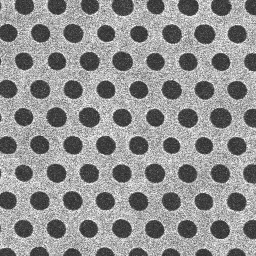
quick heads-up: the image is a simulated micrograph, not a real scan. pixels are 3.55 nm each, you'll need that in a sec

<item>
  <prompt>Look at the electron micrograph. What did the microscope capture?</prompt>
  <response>a regular array of holes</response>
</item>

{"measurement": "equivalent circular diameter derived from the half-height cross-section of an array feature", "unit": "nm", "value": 66.4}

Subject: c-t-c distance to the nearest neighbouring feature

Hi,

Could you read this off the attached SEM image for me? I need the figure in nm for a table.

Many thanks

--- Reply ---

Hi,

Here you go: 114